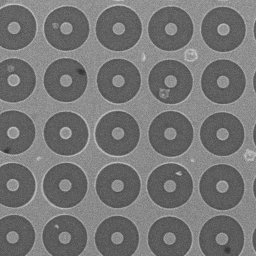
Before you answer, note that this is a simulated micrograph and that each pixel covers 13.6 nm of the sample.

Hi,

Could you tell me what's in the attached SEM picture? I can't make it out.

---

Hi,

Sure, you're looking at an array of small figures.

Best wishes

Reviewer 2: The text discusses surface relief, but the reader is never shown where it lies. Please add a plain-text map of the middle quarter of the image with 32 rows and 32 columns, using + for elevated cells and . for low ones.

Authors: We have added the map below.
.....++++.........++++.........+
.....++++..........+++.........+
......++...........++...........
++....++....+++....++.....++....
++....++....+++....++....+++....
......++.....+.....++.....++....
.....++++..........++...........
.....++++.........++++..++.....+
....++++++.......++++++........+
..+++++++++.....++++++++.....+++
++++++++++++++++++++++++++++++++
++++++++++++++++++++++++++++++++
...+++++++......++++++++......++
.....++++.........+++++........+
.....+++..........++++..........
......++...........++...........
+.....++....+++....++.....++....
++....++....+++....++....+++....
+.....++.....+.....++.....++....
......++...........++...........
......++..........++++..........
.....++++........++++++........+
...++++++++.....++++++++......++
++++++++++++++++++++++++++++++++
++++++++++++++++++++++++++++++++
....++++++.......+++++++......++
.....++++.........++++.........+
.....+++...........++.......+...
......++...........++...........
+.....++....++.....++.....+.....
++....++....+++....++....+++....
+.....++....++.....++.....++....